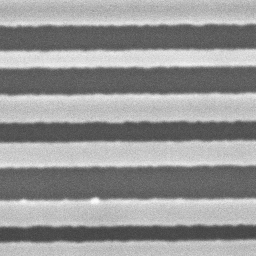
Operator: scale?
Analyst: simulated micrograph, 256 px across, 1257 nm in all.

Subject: lines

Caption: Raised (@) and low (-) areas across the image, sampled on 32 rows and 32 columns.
@@@@@@@@@@@@@@@@@@@@@@@@@@@@@@@@
@@@@@@@@@@@@@@@@@@@@@@@@@@@@@@@@
@@@@@@@@@@@@@@@@@@@@@@@@@@@@@@@@
--------------------------------
--------------------------------
--------------------------------
@@@@@-@@@@@@@@@@@@@@@@@@@@@@@@@@
@@@@@@@@@@@@@@@@@@@@@@@@@@@@@@@@
--------------------------------
--------------------------------
--------------------------------
--------------------------------
@@@@@@@@@@@@@@@@@@@@@@@@@@@@@@@@
@@@@@@@@@@@@@@@@@@@@@@@@@@@@@@@@
@@@@@@@@@@@@@@@@@@@@@@@@@@@@@@@@
--------------------------------
--------------------------------
--------------------------------
@@@@@@@@@@@@@@@@@@@@@@@@@@@@@@@@
@@@@@@@@@@@@@@@@@@@@@@@@@@@@@@@@
@@@@@@@@@@@@@@@@@@@@@@@@@@@--@@@
--------------------------------
--------------------------------
--------------------------------
--------------------------------
@@@@@@@@@@@@@@@@@@@@@@@@@@@@@@@@
@@@@@@@@@@@@@@@@@@@@@@@@@@@@@@@@
@@@@@@@@@@@@@@@@@@@@@@@@@@@@@@@@
--------------------------------
--------------------------------
@@@@@@@@@@@@@@@@@@@@@@@@@@@@@@@@
@@@@@@@@@@@@@@@@@@@@@@@@@@@@@@@@